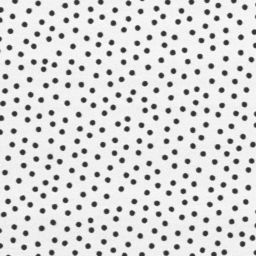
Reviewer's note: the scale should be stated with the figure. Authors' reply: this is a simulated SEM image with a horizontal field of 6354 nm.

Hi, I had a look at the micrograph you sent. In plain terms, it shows a regular array of holes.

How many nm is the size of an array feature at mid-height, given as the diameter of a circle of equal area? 153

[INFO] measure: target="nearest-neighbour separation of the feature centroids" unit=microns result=0.299